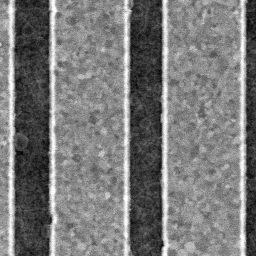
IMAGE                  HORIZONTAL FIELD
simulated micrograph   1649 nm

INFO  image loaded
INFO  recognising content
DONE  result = one or a few lines or trenches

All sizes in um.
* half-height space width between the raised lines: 0.266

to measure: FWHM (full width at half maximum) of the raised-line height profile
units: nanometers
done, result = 482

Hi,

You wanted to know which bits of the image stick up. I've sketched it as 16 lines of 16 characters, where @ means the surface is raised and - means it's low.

@--@@@@@--@@@@@-
@--@@@@@--@@@@@-
@--@@@@@--@@@@@-
@--@@@@@--@@@@@-
@--@@@@@--@@@@@-
@--@@@@@--@@@@@-
@--@@@@@--@@@@@-
@--@@@@@--@@@@@-
@--@@@@@--@@@@@-
@--@@@@@--@@@@@-
@--@@@@@--@@@@@-
@--@@@@@--@@@@@-
@--@@@@@--@@@@@-
@--@@@@@--@@@@@-
@--@@@@@--@@@@@-
@--@@@@@--@@@@@-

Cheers